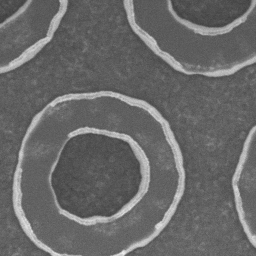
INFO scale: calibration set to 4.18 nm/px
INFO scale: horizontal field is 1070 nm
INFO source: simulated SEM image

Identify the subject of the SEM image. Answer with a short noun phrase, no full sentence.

ring-shaped raised bodies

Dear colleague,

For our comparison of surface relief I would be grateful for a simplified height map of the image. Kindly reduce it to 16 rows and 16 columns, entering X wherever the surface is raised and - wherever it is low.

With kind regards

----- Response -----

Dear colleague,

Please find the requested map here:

-XXX----XXX-----
XXXX----XXXX--XX
XXX------XXXXXXX
XX--------XXXXXX
------------XX--
----------------
---XXXXXX-------
--XXXXXXXX------
--XXX--XXXX-----
-XXX----XXX----X
-XX------XX----X
-XX------XX----X
-XXX----XXX----X
-XXXX--XXXX----X
--XXXXXXXX-----X
---XXXXX--------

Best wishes